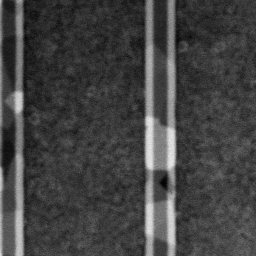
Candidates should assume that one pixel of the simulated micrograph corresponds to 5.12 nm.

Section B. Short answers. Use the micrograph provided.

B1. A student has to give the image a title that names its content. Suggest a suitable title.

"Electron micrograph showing one or a few lines or trenches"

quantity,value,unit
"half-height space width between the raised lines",0.669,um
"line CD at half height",111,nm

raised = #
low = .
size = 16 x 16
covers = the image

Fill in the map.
#........##.....
#........##.....
#........##.....
#........##.....
#........##.....
#........##.....
#........##.....
#........##.....
#........##.....
#........##.....
#........##.....
#........##.....
#........##.....
#........##.....
#........##.....
#........##.....